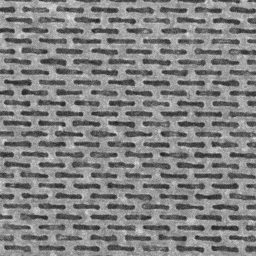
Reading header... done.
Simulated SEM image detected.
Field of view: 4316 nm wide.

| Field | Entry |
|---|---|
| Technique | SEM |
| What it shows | a regular array of holes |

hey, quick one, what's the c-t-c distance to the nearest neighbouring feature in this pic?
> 0.322 um